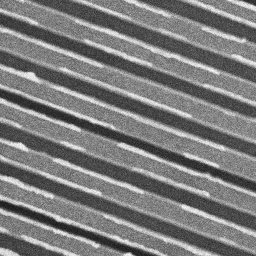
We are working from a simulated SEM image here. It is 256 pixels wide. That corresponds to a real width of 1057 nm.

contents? parallel lines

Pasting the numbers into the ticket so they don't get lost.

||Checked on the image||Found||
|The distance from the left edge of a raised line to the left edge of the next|144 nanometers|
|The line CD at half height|85.8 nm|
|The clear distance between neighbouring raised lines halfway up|15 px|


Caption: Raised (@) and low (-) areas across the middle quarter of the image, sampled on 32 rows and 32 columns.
@@@@@@@@@@@----------@@@@@@@@@@@
@@@@@@@@@@@@@-----------@@@@@@@@
-@@@@@@@@@@@@@@@----------@@@@@@
----@@@@@@@@@@@@@@@----------@@@
-------@@@@@@@@@@@@@@@----------
---------@@@@@@@@@@@@@@@--------
@-----------@@@@@@@@@@@@@@@-----
@@@@-----------@@@@@@@@@@@@@@@--
@@@@@@@-----------@@@@@@@@@@@@@@
@@@@@@@@@-----------@@@@@@@@@@@@
@@@@@@@@@@@------------@@@@@@@@@
@@@@@@@@@@@@@@------------@@@@@@
--@@@@@@@@@@@@@@@-----------@@@@
----@@@@@@@@@@@@@@@@-----------@
-------@@@@@@@@@@@@@@@@---------
@@@-------@@@@@@@@@@@@@@@-------
@@@@@--------@@@@@@@@@@@@@@@----
@@@@@@@@-------@@@@@@@@@@@@@@@@-
@@@@@@@@@@@-------@@@@@@@@@@@@@@
@@@@@@@@@@@@@--------@@@@@@@@@@@
@@@@@@@@@@@@@@@@@-------@@@@@@@@
----@@@@@@@@@@@@@@@-------@@@@@@
-------@@@@@@@@@@@@@@--------@@@
---------@@@@@@@@@@@@@@@-------@
@-----------@@@@@@@@@@@@@@------
@@@------------@@@@@@@@@@@@@@@--
@@@@@------------@@@@@@@@@@@@@@@
@@@@@@@@------------@@@@@@@@@@@@
@@@@@@@@@@@------------@@@@@@@@@
@@@@@@@@@@@@@@------------@@@@@@
--@@@@@@@@@@@@@@@-----------@@@@
-----@@@@@@@@@@@@@@------------@